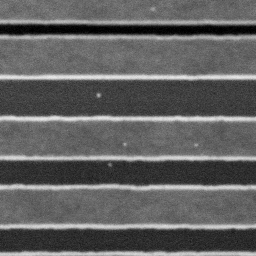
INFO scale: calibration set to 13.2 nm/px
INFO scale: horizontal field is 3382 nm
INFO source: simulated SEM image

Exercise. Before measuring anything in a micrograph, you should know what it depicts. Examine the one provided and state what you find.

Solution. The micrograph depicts lines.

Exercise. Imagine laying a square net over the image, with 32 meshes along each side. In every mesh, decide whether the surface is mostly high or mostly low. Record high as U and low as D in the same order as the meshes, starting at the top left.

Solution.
UUUUUUUUUUUUUUUUUUUUUUUUUUUUUUUU
UUUUUUUUUUUUUUUUUUUUUUUUUUUUUUUU
UUUUUUUUUUUUUUUUUUUUUUUUUUUUUUUU
DDDDDDDDDDDDDDDDDDDDDDDDDDDDDDDD
DDDDDUUUUDUDDDUUDDDDDDDDDDDDDDDD
UUUUUUUUUUUUUUUUUUUUUUUUUUUUUUUU
UUUUUUUUUUUUUUUUUUUUUUUUUUUUUUUU
UUUUUUUUUUUUUUUUUUUUUUUUUUUUUUUU
UUUUUUUUUUUUUUUUUUUUUUUUUUUUUUUU
UUUUUUUUUUUUUUUUUUUUUUUUUUUUUUUU
DDDDDDDDDDDDDDDDDDDDDDDDDDDDDDDD
DDDDDDDDDDDDDDDDDDDDDDDDDDDDDDDD
DDDDDDDDDDDDDDDDDDDDDDDDDDDDDDDD
DDDDDDDDDDDDDDDDDDDDDDDDDDDDDDDD
DDDDDDDDDDDDDDDDDDDDDDDDDDDDDDDD
UUUUUUUUUUUUUUUUUUUUUUUUUUUUUUUU
UUUUUUUUUUUUUUUUUUUUUUUUUUUUUUUU
UUUUUUUUUUUUUUUUUUUUUUUUUUUUUUUU
UUUUUUUUUUUUUUUUUUUUUUUUUUUUUUUU
UUUUUUUUUUUUUUUUUUUUUUUUUUUUUUUU
DDDDDDDDDDDDDDDDDDDDDDDDDDDDDDDD
DDDDDDDDDDDDDDDDDDDDDDDDDDDDDDDD
DDDDDDDDDDDDDDDDDDDDDDDDDDDDDDDD
UUUUUUUUUUUUUUUUUDUUUUUUUUUUUUUU
UUUUUUUUUUUUUUUUUUUUUUUUUUUUUUUU
UUUUUUUUUUUUUUUUUUUUUUUUUUUUUUUU
UUUUUUUUUUUUUUUUUUUUUUUUUUUUUUUU
UUUUUUUUUUUUUUUUUUUUUUUUUUUUUUUU
DDDDDDDDDDDDDDDDDDDDDDDDDDDDDDDD
DDDDDDDDDDDDDDDDDDDDDDDDDDDDDDDD
DDDDDDDDDDDDDDDDDDDDDDDDDDDDDDDD
DDDDDDDDDDDDDDDDDDDDDDDDDDDDDDDD